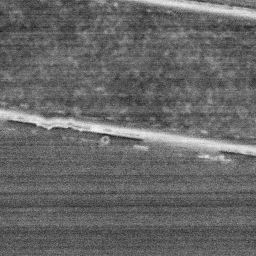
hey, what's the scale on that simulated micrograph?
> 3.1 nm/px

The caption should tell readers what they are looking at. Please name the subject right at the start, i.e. one or a few lines or trenches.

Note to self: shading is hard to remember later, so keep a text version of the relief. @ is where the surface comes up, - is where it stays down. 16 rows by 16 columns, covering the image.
-------------@@@
----------------
----------------
----------------
----------------
----------------
----------------
@@--------------
@@@@@@@@@@------
@@@@@@@@@@@@@@@@
@@@@@@@@@@@@@@@@
@@@@@@@@@@@@@@@@
@@@@@@@@@@@@@@@@
@@@@@@@@@@@@@@@@
@@@@@@@@@@@@@@@@
@@@@@@@@@@@@@@@@